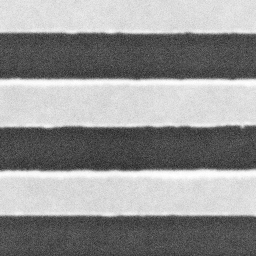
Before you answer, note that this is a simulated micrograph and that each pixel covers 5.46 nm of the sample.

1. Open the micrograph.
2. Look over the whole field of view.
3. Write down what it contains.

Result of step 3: lines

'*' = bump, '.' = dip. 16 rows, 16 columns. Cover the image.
****************
****************
................
................
................
****************
****************
****************
................
................
................
****************
****************
................
................
................